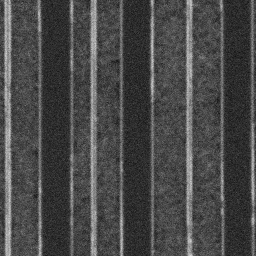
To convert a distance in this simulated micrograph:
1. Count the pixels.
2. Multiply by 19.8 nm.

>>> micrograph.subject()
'lines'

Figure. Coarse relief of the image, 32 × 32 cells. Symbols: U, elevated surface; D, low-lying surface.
DDDDDUUUUDDDDDDUUUUDDDDDDDDDUUUU
DDDDDUUUUDDDDDDUUUUDDDDDDDDDUUUU
DDDDDUUUUDDDDDDUUUUDDDDDDDDDUUUU
DDDDDUUUUDDDDDDUUUUDDDDDDDDDUUUU
DDDDDUUUUDDDDDDUUUUDDDDDDDDDUUUU
DDDDDUUUUDDDDDDUUUUDDDDDDDDDUUUU
DDDDDUUUUDDDDDDUUUUDDDDDDDDDUUUU
DDDDDUUUUDDDDDDUUUUDDDDDDDDDUUUU
DDDDDUUUUDDDDDDUUUUDDDDDDDDDUUUU
DDDDDUUUUDDDDDDUUUUDDDDDDDDDUUUU
DDDDDUUUUDDDDDDUUUUDDDDDDDDDUUUU
DDDDDUUUUDDDDDDUUUUDDDDDDDDDUUUU
DDDDDUUUUDDDDDDUUUUDDDDDDDDDUUUU
DDDDDUUUUDDDDDDUUUUDDDDDDDDDUUUU
DDDDDUUUUDDDDDDUUUUDDDDDDDDDUUUU
DDDDDUUUUDDDDDDUUUUDDDDDDDDDUUUU
DDDDDUUUUDDDDDDUUUUDDDDDDDDDUUUU
DDDDDUUUUDDDDDDUUUUDDDDDDDDDUUUU
DDDDDUUUUDDDDDDUUUUDDDDDDDDDUUUU
DDDDDUUUUDDDDDDUUUUDDDDDDDDDUUUU
DDDDDUUUUDDDDDDUUUUDDDDDDDDDUUUU
DDDDDUUUUDDDDDDUUUUDDDDDDDDDUUUU
DDDDDUUUUDDDDDDUUUUDDDDDDDDDUUUU
DDDDDUUUUDDDDDDUUUUDDDDDDDDDUUUU
DDDDDUUUUDDDDDDUUUUDDDDDDDDDUUUU
DDDDDUUUUDDDDDDUUUUDDDDDDDDDUUUU
DDDDDUUUUDDDDDDUUUUDDDDDDDDDUUUU
DDDDDUUUUDDDDDDUUUUDDDDDDDDDUUUU
DDDDDUUUUDDDDDDUUUUDDDDDDDDDUUUU
DDDDDUUUUDDDDDDUUUUDDDDDDDDDUUUU
DDDDDUUUUDDDDDDUUUUDDDDDDDDDUUUU
DDDDDUUUUDDDDDDUUUUDDDDDDDDDUUUU